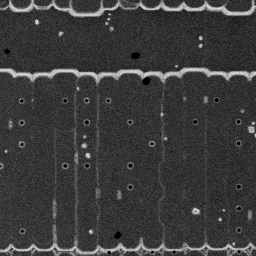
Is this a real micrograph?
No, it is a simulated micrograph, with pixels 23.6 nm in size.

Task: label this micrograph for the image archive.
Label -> wiring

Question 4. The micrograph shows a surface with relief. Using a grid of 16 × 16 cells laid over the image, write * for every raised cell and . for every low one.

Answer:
.*..***..**..***
................
................
................
*...*......**...
****************
****************
****************
****************
****************
****************
****************
****************
****************
****************
****************